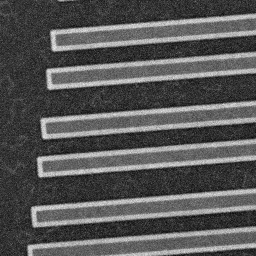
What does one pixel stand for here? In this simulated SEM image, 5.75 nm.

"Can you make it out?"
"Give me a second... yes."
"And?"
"parallel lines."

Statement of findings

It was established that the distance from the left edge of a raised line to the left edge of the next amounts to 0.247 micrometres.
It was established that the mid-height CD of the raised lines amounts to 92.3 nanometres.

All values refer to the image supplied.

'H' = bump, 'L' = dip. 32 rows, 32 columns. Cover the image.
LLLLLLLLLLLLLLLLLLLLLLLLLLLLLLLL
LLLLLLLLLLLLLLLLLLLLLLLLLLLLLLLL
LLLLLLLLLLLLLLLLLLLLLLLLLLHHHHHH
LLLLLLLLLLLLLHHHHHHHHHHHHHHHHHHH
LLLLLLLHHHHHHHHHHHHHHHHHHHHLLLLL
LLLLLLLHHHHHHHLLLLLLLLLLLLLLLLLL
LLLLLLLLLLLLLLLLLLLLLLLLLLLLLLLL
LLLLLLLLLLLLLLLLLLLLLLLLHHHHHHHH
LLLLLLLLLLLLHHHHHHHHHHHHHHHHHHHH
LLLLLLHHHHHHHHHHHHHHHHHLLLLLLLLL
LLLLLLHHHHHLLLLLLLLLLLLLLLLLLLLL
LLLLLLLLLLLLLLLLLLLLLLLLLLLLLLLL
LLLLLLLLLLLLLLLLLLLLLLLLLLLLLLLL
LLLLLLLLLLLLLLLLLLLLLLLLLLHHHHHH
LLLLLLLLLLLLLHHHHHHHHHHHHHHHHHHH
LLLLLHHHHHHHHHHHHHHHHHHHHLLLLLLL
LLLLLLHHHHHHHLLLLLLLLLLLLLLLLLLL
LLLLLLLLLLLLLLLLLLLLLLLLLLLLLLLL
LLLLLLLLLLLLLLLLLLLLLLLHHHHHHHHH
LLLLLLLLLLHHHHHHHHHHHHHHHHHHHHHH
LLLLLHHHHHHHHHHHHHHHHHLLLLLLLLLL
LLLLLHHHHHLLLLLLLLLLLLLLLLLLLLLL
LLLLLLLLLLLLLLLLLLLLLLLLLLLLLLLL
LLLLLLLLLLLLLLLLLLLLLLLLLLLLLLLL
LLLLLLLLLLLLLLLLLLLLLLLLHHHHHHHH
LLLLLLLLLLLLHHHHHHHHHHHHHHHHHHHH
LLLLHHHHHHHHHHHHHHHHHHHHHLLLLLLL
LLLLHHHHHHHLLLLLLLLLLLLLLLLLLLLL
LLLLLLLLLLLLLLLLLLLLLLLLLLLLLLLL
LLLLLLLLLLLLLLLLLLLLLHHHHHHHHHHH
LLLLLLLLLHHHHHHHHHHHHHHHHHHHHHHH
LLLLHHHHHHHHHHHHHHHHHHLLLLLLLLLL